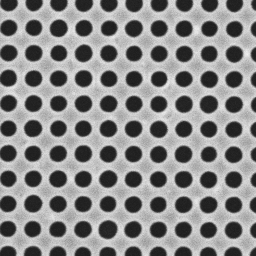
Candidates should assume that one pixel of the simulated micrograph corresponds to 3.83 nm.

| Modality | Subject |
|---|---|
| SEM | a regular array of holes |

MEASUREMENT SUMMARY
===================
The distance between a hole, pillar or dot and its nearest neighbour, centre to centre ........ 95.5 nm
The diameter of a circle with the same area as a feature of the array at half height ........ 64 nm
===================